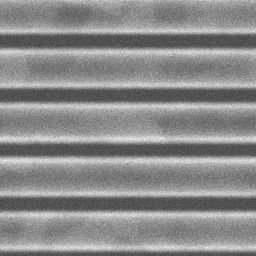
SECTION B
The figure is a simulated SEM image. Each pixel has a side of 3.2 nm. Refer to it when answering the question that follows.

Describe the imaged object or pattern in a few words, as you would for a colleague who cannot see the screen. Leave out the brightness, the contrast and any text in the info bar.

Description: parallel lines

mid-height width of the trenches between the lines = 54.9 nanometres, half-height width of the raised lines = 119 nanometers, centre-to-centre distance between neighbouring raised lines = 0.173 µm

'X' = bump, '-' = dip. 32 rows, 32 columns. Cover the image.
XXXXXXXXXXXXXXXXXXXXXXXXXXXXXXXX
XXXXXXXXXXXXXXXXXXXXXXXXXXXXXXXX
XXXXXXXXXXXXXXXXXXXXXXXXXXXXXXXX
XXXXXXXXXXXXXXXXXXXXXXXXXXXXXXXX
--------------------------------
--------------------------------
XXXXXXXXXXXXXXXXXXXXXXXXXXXXXXXX
XXXXXXXXXXXXXXXXXXXXXXXXXXXXXXXX
XXXXXXXXXXXXXXXXXXXXXXXXXXXXXXXX
XXXXXXXXXXXXXXXXXXXXXXXXXXXXXXXX
XXXXXXXXXXXXXXXXXXXXXXXXXXXXXXXX
--------------------------------
--------------------------------
XXXXXXXXXXXXXXXXXXXXXXXXXXXXXXXX
XXXXXXXXXXXXXXXXXXXXXXXXXXXXXXXX
XXXXXXXXXXXXXXXXXXXXXXXXXXXXXXXX
XXXXXXXXXXXXXXXXXXXXXXXXXXXXXXXX
XXXXXXXXXXXXXXXXXXXXXXXXXXXXXXXX
--------------------------------
--------------------------------
XXXXXXXXXXXXXXXXXXXXXXXXXXXXXXXX
XXXXXXXXXXXXXXXXXXXXXXXXXXXXXXXX
XXXXXXXXXXXXXXXXXXXXXXXXXXXXXXXX
XXXXXXXXXXXXXXXXXXXXXXXXXXXXXXXX
--------------------------------
--------------------------------
--------------------------------
XXXXXXXXXXXXXXXXXXXXXXXXXXXXXXXX
XXXXXXXXXXXXXXXXXXXXXXXXXXXXXXXX
XXXXXXXXXXXXXXXXXXXXXXXXXXXXXXXX
XXXXXXXXXXXXXXXXXXXXXXXXXXXXXXXX
--------------------------------